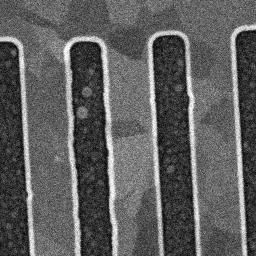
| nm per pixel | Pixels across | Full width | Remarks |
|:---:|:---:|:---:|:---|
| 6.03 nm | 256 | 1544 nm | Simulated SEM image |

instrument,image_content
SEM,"one or a few lines or trenches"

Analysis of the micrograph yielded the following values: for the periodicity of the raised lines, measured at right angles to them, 0.503 µm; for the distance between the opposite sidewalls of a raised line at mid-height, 278 nm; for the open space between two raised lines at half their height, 0.222 micrometres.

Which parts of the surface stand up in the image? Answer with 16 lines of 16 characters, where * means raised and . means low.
****************
****************
.****.****..***.
.***...**...***.
.***...**...***.
.***...***..***.
..**...***..***.
..**...***..***.
..**...***..***.
..**...***..***.
..***..***..***.
..***..***..***.
..***..***..***.
..***..***..***.
..***..***..***.
..***..***..***.